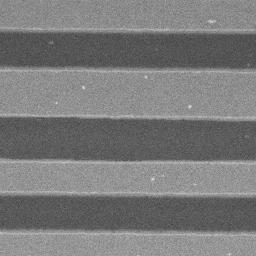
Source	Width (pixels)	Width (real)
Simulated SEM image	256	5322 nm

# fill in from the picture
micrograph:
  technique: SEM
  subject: lines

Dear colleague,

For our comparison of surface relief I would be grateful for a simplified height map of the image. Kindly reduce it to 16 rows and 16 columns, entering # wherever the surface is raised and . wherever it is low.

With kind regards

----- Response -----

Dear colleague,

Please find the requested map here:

################
################
................
................
###############.
################
################
................
................
................
################
################
................
................
................
################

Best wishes